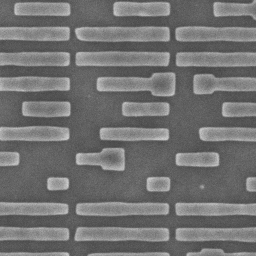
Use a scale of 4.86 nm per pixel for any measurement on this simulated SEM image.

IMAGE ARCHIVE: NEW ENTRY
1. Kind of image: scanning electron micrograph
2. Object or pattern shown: wiring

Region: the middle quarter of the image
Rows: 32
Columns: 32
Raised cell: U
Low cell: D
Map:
DDDDDDDDDDDDDDDDDDDDDDDDDDDDDDDD
DDDDDDDDDDDDDDDDDDDDDDDDDDDDDDDD
DDDDDDDDDDDDDDDDDDDDDDDUUUUDDDDD
DDDDDDDDDDDDDDDDDDDDDDUUUUUUDDDD
UDDDDDDDUUUUUUUUUUUUUUUUUUUUDDDD
UDDDDDDDUUUUUUUUUUUUUUUUUUUUDDDD
UDDDDDDDDUUUUUUUUUUUUUUUUUUUDDDD
DDDDDDDDDDDDDDDDDDDDDDUUUUUDDDDD
DDDDDDDDDDDDDDDDDDDDDDDDDDDDDDDD
DDDDDDDDDDDDDDDDDDDDDDDDDDDDDDDD
UUDDDDDDDDDDDDDUUUUUUUUUUUDDDDDD
UUDDDDDDDDDDDDDUUUUUUUUUUUDDDDDD
UUDDDDDDDDDDDDDUUUUUUUUUUUDDDDDD
DDDDDDDDDDDDDDDDDDDDDDDDDDDDDDDD
DDDDDDDDDDDDDDDDDDDDDDDDDDDDDDDD
DDDDDDDDDDDDDDDDDDDDDDDDDDDDDDDD
UDDDDDDDDUUUUUUUUUUUUUUUUUDDDDDD
UDDDDDDDDUUUUUUUUUUUUUUUUUDDDDDD
UDDDDDDDDUUUUUUUUUUUUUUUUUDDDDDD
DDDDDDDDDDDDDDDDDDDDDDDDDDDDDDDD
DDDDDDDDDDDDDDDDDDDDDDDDDDDDDDDD
DDDDDDDDDDUUUUUDDDDDDDDDDDDDDDDD
DDDUUUUUUUUUUUUDDDDDDDDDDDDDDUUU
DDDUUUUUUUUUUUUDDDDDDDDDDDDDUUUU
DDDUUUUUUUUUUUUDDDDDDDDDDDDDUUUU
DDDDDDDDDUUUUUUDDDDDDDDDDDDDDDDD
DDDDDDDDDDDDUUUDDDDDDDDDDDDDDDDD
DDDDDDDDDDDDDDDDDDDDDDDDDDDDDDDD
DDDDDDDDDDDDDDDDDDDDDUUUUUDDDDDD
UDDDDDDDDDDDDDDDDDDDDUUUUUDDDDDD
UDDDDDDDDDDDDDDDDDDDDUUUUUDDDDDD
DDDDDDDDDDDDDDDDDDDDDUUUUUDDDDDD